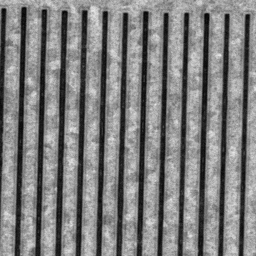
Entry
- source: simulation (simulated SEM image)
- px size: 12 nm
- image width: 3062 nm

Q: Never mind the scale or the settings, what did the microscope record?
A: parallel lines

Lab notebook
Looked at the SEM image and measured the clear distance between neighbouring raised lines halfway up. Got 5.99 px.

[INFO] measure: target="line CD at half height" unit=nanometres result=164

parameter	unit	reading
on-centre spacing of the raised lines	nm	243